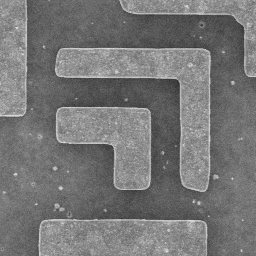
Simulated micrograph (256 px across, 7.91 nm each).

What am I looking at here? wiring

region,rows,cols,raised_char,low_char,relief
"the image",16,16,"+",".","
++......++++++++
++.............+
++.............+
++..+++++++++..+
++..+++++++++..+
++.........++...
++.........++...
....+++++..++...
....+++++..++...
.......++..++...
.......++..++...
.......++...+...
................
................
...++++++++++...
..+++++++++++...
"